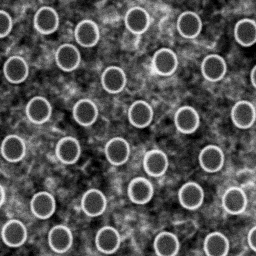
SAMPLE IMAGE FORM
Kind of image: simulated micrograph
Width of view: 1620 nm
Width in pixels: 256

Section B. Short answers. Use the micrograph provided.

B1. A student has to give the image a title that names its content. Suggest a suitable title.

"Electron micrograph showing a regular array of raised bodies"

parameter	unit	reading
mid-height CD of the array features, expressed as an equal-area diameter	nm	155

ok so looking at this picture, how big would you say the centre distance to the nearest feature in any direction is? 0.267 microns